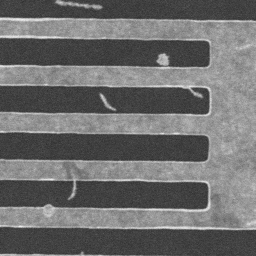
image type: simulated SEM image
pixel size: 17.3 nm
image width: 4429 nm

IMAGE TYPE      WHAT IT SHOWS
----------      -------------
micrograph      groups of lines, slits or small figures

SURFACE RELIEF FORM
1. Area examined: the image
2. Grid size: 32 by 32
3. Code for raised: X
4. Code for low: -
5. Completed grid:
--------------------------------
--------------------------------
XX---XXXXXXXX-XXX---------------
XXXXXXXXXXXXXXXXXXXXXXXXXXXXXXXX
XXXXXXXXXXXXXXXXXXXXXXXXXXXXXXXX
--------------------------XXXXXX
--------------------------XXXXXX
--------------------------XXXXXX
XXXXXXXXXXXXXXXXXXX------XXXXXXX
XXXXXXXXXXXXXXXXXXXXXXXXXXXXXXXX
XXXXXXXXXXXXXXXXXXXXXXXXXXXXXXXX
--------------------------XXXXXX
--------------------------XXXXXX
--------------------------XXXXXX
XXXXXXXXXXXXXXXXXXXXXXXXXXXXXXXX
XXXXXXXXXXXXXXXXXXXXXXXXXXXXXXXX
------XXXXXXXXXXXXXXXXXXXXXXXXXX
--------------------------XXXXXX
--------------------------XXXXXX
--------------------------XXXXXX
XXXXXXXXXXXXXXXXXXXXXXXXXXXXXXXX
XXXXXXXXXXXXXXXXXXXXXXXXXXXXXXXX
---------X--------XXXXXXXXXXXXXX
--------------------------XXXXXX
--------------------------XXXXXX
--------------------------XXXXXX
XXXXXXXXXXXXXXXXXXXXXXXXXXXXXXXX
XXXXXXXXXXXXXXXXXXXXXXXXXXXXXXXX
---------------X----------XXXXXX
--------------------------------
--------------------------------
--------------------------------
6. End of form